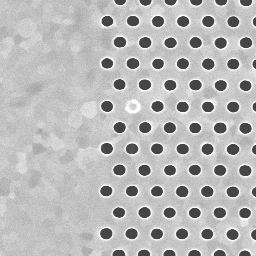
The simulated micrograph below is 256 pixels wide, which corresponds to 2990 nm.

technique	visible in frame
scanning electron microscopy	a regular array of holes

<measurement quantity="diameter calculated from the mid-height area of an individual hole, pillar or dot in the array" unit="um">0.135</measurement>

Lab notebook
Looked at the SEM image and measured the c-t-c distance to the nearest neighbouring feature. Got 285 nm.